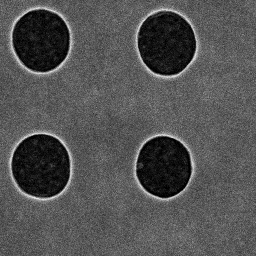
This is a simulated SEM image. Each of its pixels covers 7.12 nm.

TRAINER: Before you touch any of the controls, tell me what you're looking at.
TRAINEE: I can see holes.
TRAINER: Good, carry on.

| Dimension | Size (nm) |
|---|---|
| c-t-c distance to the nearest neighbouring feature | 878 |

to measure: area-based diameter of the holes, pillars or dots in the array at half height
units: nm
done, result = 436